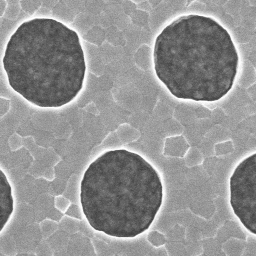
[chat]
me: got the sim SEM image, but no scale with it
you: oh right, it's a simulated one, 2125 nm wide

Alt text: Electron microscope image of holes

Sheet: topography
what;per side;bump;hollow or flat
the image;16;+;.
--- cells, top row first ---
++++++++++++++++
+...+++++++...++
+....+++++....++
.....+++++.....+
.....+++++.....+
+....+++++....++
++..++++++++++++
++++++++++++++++
++++++++++++++++
+++++++.++++++++
++++++....+++++.
.++++.....++++..
.++++.....++++..
.++++.....+++++.
++++++...+++++++
++++++++++++++++